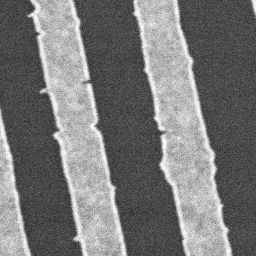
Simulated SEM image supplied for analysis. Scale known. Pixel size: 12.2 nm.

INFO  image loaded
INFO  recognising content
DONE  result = one or a few lines or trenches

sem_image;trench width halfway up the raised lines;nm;731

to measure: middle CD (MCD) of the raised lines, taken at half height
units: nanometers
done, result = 485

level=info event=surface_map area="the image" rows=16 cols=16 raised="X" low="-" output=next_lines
--XXX----XX-----
--XXX----XX-----
---XX----XX-----
---XX----XXX----
---XX----XXX----
---XXX----XX----
---XXX----XX----
----XX----XXX---
----XX----XXX---
----XX----XXX---
X---XXX---XXX---
X---XXX----XX---
X----XX----XXX--
X----XX----XXX--
X----XXX---XXX--
XX---XXX----XX--